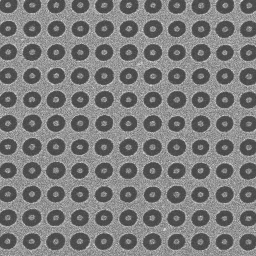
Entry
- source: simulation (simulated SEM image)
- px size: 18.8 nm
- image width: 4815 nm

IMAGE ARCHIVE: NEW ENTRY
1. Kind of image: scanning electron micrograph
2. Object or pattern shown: a regular array of ring-shaped grooves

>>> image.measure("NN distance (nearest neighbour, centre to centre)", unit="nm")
441